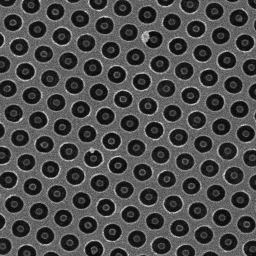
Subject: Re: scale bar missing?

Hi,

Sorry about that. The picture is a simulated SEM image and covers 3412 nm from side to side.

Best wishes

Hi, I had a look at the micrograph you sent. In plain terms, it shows a regular array of ring-shaped grooves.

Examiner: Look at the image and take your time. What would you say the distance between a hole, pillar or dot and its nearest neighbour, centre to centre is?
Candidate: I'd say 334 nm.